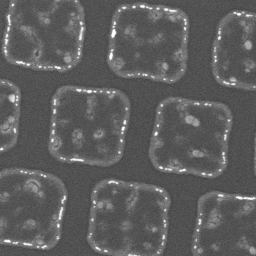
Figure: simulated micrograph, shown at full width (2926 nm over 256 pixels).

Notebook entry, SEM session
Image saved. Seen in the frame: raised bodies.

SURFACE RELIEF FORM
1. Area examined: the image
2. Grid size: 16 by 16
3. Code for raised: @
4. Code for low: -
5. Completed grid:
-@@@@---@@------
-@@@@--@@@@@--@@
@@@@@--@@@@@--@@
-@@@@--@@@@--@@@
--------@@@---@@
@---------------
@--@@@@@--@@@---
@--@@@@@--@@@@--
@--@@@@@--@@@@--
---@@@@---@@@@--
----------@@@@--
@@@@--@@--------
@@@@--@@@@---@@@
@@@@--@@@@---@@@
@@@@--@@@@--@@@@
------@@@@--@@@@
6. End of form